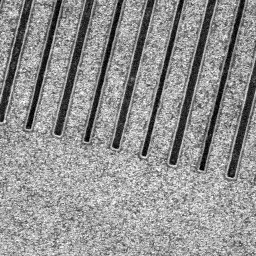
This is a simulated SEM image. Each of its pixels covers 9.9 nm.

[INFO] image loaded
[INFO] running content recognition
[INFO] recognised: parallel lines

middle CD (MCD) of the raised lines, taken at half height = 220 nanometers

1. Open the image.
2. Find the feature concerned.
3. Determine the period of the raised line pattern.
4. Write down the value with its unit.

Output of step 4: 292 nm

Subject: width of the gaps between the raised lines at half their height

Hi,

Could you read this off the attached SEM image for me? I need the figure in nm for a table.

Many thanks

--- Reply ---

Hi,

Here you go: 70.9